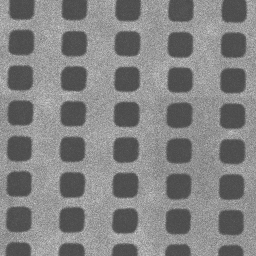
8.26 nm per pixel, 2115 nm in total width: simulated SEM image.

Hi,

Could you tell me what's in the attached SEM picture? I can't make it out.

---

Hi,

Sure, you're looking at a regular array of holes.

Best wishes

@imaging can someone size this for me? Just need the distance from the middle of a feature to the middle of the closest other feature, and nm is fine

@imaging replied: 292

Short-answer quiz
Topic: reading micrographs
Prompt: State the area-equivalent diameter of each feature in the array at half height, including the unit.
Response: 228 nanometres